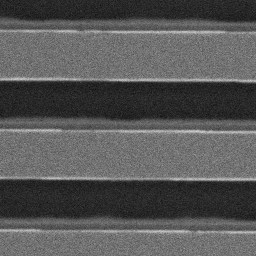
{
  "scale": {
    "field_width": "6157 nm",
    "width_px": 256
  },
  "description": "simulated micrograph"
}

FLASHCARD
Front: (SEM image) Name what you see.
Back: lines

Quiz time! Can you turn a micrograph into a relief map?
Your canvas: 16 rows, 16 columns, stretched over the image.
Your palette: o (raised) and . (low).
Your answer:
................
ooooooooooooo...
oooooooooooooooo
oooooooooooooooo
oooooooooooooooo
................
................
................
oooooooooooooooo
oooooooooooooooo
oooooooooooooooo
................
................
................
oooooooooooooooo
oooooooooooooooo